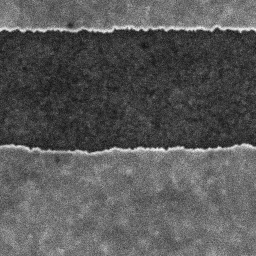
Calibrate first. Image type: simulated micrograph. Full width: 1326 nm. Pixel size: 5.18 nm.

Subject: one or a few lines or trenches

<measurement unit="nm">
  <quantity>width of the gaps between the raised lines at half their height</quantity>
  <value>613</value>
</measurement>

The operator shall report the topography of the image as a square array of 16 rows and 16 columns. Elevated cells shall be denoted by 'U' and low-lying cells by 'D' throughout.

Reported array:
UUUUUUUUUUUUUUUU
UUUUUUUUUUUUUUUU
DDDDDDDDDDDDDDDD
DDDDDDDDDDDDDDDD
DDDDDDDDDDDDDDDD
DDDDDDDDDDDDDDDD
DDDDDDDDDDDDDDDD
DDDDDUDDDDDDDDDD
DDDDDDDDDDDDDDDD
UUUUUDUUUUUUUUUU
UUUUUUUUUUUUUUUU
UUUUUUUUUUUUUUUU
UUUUUUUUUUUUUUUU
UUUUUUUUUUUUUUUU
UUUUUUUUUUUUUUUU
UUUUUUUUUUUUUUUU